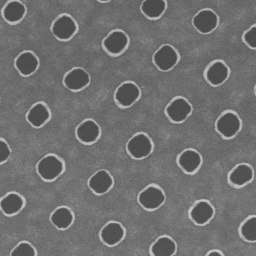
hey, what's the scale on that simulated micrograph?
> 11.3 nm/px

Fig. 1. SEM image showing a regular array of raised bodies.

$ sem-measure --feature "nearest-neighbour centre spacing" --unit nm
590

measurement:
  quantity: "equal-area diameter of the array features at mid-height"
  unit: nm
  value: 277